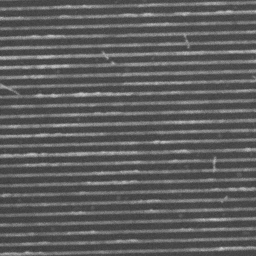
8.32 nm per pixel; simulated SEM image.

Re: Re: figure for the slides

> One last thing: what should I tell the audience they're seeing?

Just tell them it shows parallel lines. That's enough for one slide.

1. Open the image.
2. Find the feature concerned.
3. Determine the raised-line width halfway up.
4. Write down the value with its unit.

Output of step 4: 20.8 nm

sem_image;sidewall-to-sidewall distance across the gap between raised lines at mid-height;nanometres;61.3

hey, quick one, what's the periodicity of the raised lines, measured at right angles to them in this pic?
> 81.8 nm